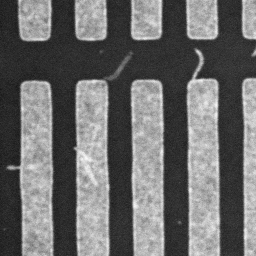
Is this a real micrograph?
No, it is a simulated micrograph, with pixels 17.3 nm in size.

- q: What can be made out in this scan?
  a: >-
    wiring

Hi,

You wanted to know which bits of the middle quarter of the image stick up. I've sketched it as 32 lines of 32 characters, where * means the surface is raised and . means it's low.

................................
................................
................................
................................
....******.......*******........
...********......*******.......*
...********......*******.......*
...********......*******.......*
...********......*******.......*
...********......*******.......*
...********......*******.......*
...********......********......*
...********......********......*
...*******.......********......*
...*******.......********......*
...*******.......********......*
...*******.......********......*
...*******.......********......*
...*******.......********......*
...*******.......********......*
...*******.......********......*
...*******.......********......*
...*******.......********......*
...*******.......********......*
...********......********......*
...********......********......*
...********......********......*
...********......********......*
...********......********......*
...********......********......*
...********......********......*
...********......********......*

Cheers